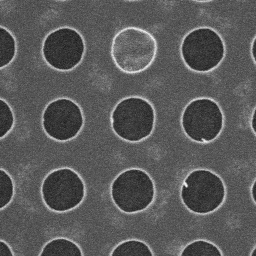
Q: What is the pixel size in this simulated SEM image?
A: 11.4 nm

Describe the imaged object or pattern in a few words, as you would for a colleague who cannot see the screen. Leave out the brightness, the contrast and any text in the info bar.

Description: a regular array of holes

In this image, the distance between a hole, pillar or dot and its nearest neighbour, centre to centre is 799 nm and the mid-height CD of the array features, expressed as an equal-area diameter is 479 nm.